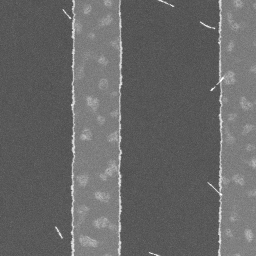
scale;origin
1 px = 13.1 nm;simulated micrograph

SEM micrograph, one or a few lines or trenches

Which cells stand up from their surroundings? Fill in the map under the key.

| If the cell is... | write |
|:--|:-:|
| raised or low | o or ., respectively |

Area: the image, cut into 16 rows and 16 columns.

ooooo..ooooooo..
ooooo...oooooo..
ooooo...oooooo..
ooooo...oooooo..
ooooo...oooooo..
ooooo..ooooooo..
ooooo..ooooooo..
ooooo..ooooooo..
ooooo..ooooooo..
ooooo..ooooooo..
ooooo..ooooooo..
ooooo..ooooooo..
ooooo..ooooooo..
ooooo..ooooooo..
ooooo..ooooooo..
ooooo..ooooooo..